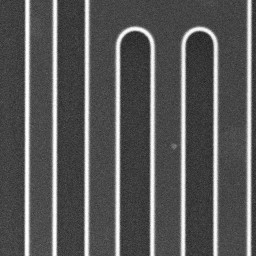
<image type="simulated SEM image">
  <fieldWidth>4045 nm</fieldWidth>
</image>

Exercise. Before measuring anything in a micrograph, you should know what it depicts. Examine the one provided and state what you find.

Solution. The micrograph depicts groups of lines, slits or small figures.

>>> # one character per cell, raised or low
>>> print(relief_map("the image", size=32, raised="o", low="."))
...oooo....oooooooooooooooooooo.
...oooo....oooooooooooooooooooo.
...oooo....oooooooooooooooooooo.
...oooo....oooooooooooooooooooo.
...oooo....oooo....oooo...ooooo.
...oooo....oooo....oooo....oooo.
...oooo....oooo....oooo....oooo.
...oooo....oooo....oooo....oooo.
...oooo....oooo....oooo....oooo.
...oooo....oooo....oooo....oooo.
...oooo....oooo....oooo....oooo.
...oooo....oooo....oooo....oooo.
...oooo....oooo....oooo....oooo.
...oooo....oooo....oooo....oooo.
...oooo....oooo....oooo....oooo.
...oooo....oooo....oooo....oooo.
...oooo....oooo....oooo....oooo.
...oooo....oooo....oooo....oooo.
...oooo....oooo....oooo....oooo.
...oooo....oooo....oooo....oooo.
...oooo....oooo....oooo....oooo.
...oooo....oooo....oooo....oooo.
...oooo....oooo....oooo....oooo.
...oooo....oooo....oooo....oooo.
...oooo....oooo....oooo....oooo.
...oooo....oooo....oooo....oooo.
...oooo....oooo....oooo....oooo.
...oooo....oooo....oooo....oooo.
...oooo....oooo....oooo....oooo.
...oooo....oooo....oooo....oooo.
...oooo....oooo....oooo....oooo.
...oooo....oooo....oooo....oooo.